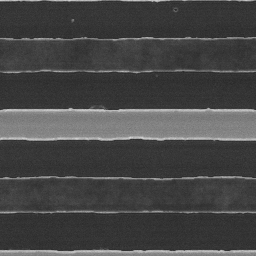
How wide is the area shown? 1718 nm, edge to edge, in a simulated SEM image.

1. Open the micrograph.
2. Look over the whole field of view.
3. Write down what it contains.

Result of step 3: lines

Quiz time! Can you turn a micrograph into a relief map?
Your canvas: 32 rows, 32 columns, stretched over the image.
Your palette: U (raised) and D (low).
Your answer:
DDDDDDDDDDDDDDDDDDDDDDDDDDDDDDDD
DDDDDDDDDDDDDDDDDDDDDDDDDDDDDDDD
DDDDDDDDDDDDDDDDDDDDDDDDDDDDDDDD
DDDDDDDDDDDDDDDDDDDDDDDDDDDDDDDD
DDDDDDDDDDDDDDDDDDDDDDDDDDDDDDDD
UUUUUUUUUUUUUUUUUUUUUUUUUUUUUUUU
UUUUUUUUUUUUUUUUUUUUUUUUUUUUUUUU
UUUUUUUUUUUUUUUUUUUUUUUUUUUUUUUU
UUUUUUUUUUUUUUUUUUUUUUUUUUUUUUUU
DDDDDDDDDDDDDDDDDDDDDDDDDDDDDDDD
DDDDDDDDDDDDDDDDDDDDDDDDDDDDDDDD
DDDDDDDDDDDDDDDDDDDDDDDDDDDDDDDD
DDDDDDDDDDDDDDDDDDDDDDDDDDDDDDDD
DDDDDDDDDDDDDDDDDDDDDDDDDDDDDDDD
UUUUUUUUUUUUUUUUUUUUUUUUUUUUUUUU
UUUUUUUUUUUUUUUUUUUUUUUUUUUUUUUU
UUUUUUUUUUUUUUUUUUUUUUUUUUUUUUUU
DDDUUUUDDDDDUUUDDDDUUDDDDDDUUUUU
DDDDDDDDDDDDDDDDDDDDDDDDDDDDDDDD
DDDDDDDDDDDDDDDDDDDDDDDDDDDDDDDD
DDDDDDDDDDDDDDDDDDDDDDDDDDDDDDDD
DDDDDDDDDDDDDDDDDDDDDDDDDDDDDDDD
UUUUUUUUUUUUUUUUUUUUUUUUUUUUUUUU
UUUUUUUUUUUUUUUUUUUUUUUUUUUUUUUU
UUUUUUUUUUUUUUUUUUUUUUUUUUUUUUUU
UUUUUUUUUUUUUUUUUUUUUUUUUUUUUUUU
UUDDDUDDDDDDUUUDDDDDDDDDDDDUUUDU
DDDDDDDDDDDDDDDDDDDDDDDDDDDDDDDD
DDDDDDDDDDDDDDDDDDDDDDDDDDDDDDDD
DDDDDDDDDDDDDDDDDDDDDDDDDDDDDDDD
DDDDDDDDDDDDDDDDDDDDDDDDDDDDDDDD
UUUUUUUUUUUUUUUUUUUUUUUUUUUUUUUU